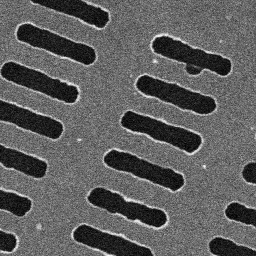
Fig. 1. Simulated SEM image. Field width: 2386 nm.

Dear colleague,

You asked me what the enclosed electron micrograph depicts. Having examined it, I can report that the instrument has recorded holes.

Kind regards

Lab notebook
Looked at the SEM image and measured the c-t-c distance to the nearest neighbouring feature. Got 387 nm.